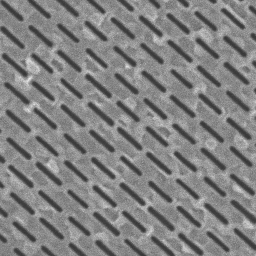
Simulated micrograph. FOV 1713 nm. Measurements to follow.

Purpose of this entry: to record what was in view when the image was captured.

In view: a regular array of holes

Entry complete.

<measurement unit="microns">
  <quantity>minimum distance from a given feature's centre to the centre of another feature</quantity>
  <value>0.181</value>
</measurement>